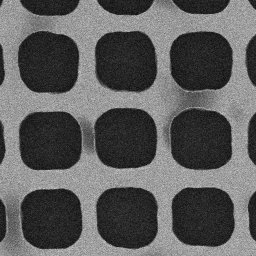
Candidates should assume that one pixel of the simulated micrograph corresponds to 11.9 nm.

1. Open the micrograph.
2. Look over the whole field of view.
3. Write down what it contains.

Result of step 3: a regular array of holes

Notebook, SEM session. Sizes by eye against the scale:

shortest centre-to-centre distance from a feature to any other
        901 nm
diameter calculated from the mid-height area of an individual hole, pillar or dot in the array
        768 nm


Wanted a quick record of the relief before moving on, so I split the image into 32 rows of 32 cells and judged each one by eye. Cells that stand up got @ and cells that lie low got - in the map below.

@@@-------@@-------@@@------@@@-
@@@@-----@@@@-----@@@@@----@@@@@
@@@@@@@@@@@@@@@@@@@@@@@@@@@@@@@@
@@@@@@@@@@@@@@@@@@@@@@@@@@@@@@@@
@@@-----@@@@@-----@@@@------@@@@
@@@-------@@-------@@@-------@@-
@@--------@@-------@@--------@@-
@@--------@@--------@--------@@-
@@--------@@--------@--------@@-
-@@-------@@--------@--------@@-
@@@------@@@@------@@@------@@@@
@@@@@---@@@@@@@@@@@@@@@@@@@@@@@@
@@@@@@@@@@@@@@@@@@@@@@@@@@@@@@@@
@@@@@@@@@@@@@@@-@@@@@@@@-@@@@@@@
@@@------@@@@------@@@------@@@@
@@@-------@@-------@@--------@@-
@@--------@@--------@--------@@-
-@--------@@--------@--------@@-
-@@-------@@--------@--------@@-
-@@-------@@-------@@@-------@@-
@@@------@@@@------@@@------@@@@
@@@@@@@@@@@@@@@@@@@@@@@@@@@@@@@@
@@@@@@@@@@@@@@@@@@@@@@@@@@@@@@@@
@@@@@@@@@@@@@@---@@@@@@----@@@@@
@@@-------@@@------@@@-------@@-
@@@-------@@--------@--------@@-
-@@-------@@--------@@-------@@-
-@@-------@@--------@@-------@@-
-@@-------@@--------@@-------@@-
-@@-------@@@------@@@-------@@-
@@@@-----@@@@@-----@@@@-----@@@@
@@@@@@@@@@@@@@@@@@@@@@@@@@@@@@@@